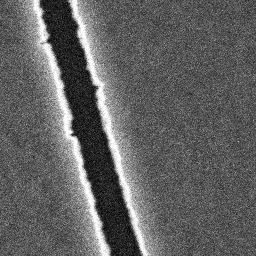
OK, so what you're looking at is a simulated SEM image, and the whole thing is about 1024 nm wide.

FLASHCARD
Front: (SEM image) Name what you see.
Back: one or a few lines or trenches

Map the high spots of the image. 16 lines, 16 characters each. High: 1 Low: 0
1100011111111111
1110011111111111
1110011111111111
1110011111111111
1111001111111111
1111001111111111
1111001111111111
1111000111111111
1111100111111111
1111100111111111
1111100111111111
1111100011111111
1111110011111111
1111110011111111
1111110001111111
1111111001111111